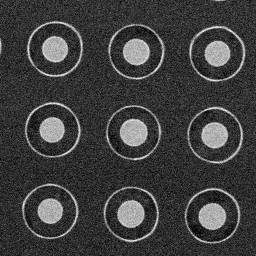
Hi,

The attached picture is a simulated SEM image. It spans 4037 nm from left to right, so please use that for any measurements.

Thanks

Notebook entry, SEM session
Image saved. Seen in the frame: an array of small figures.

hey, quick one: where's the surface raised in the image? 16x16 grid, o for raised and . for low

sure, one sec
oooooooooooooooo
ooo.oooooooooooo
oo...oo...oo...o
oo...oo...oo...o
ooo.oooo..oo...o
oooooooooooooooo
oooooooooooooooo
oo...oo...oo...o
oo...oo...oo...o
oo..ooo..ooo...o
oooooooooooooooo
oooooooooooooooo
oo...oo...oo...o
oo...oo...oo...o
oo..ooo..ooo...o
oooooooooooooooo